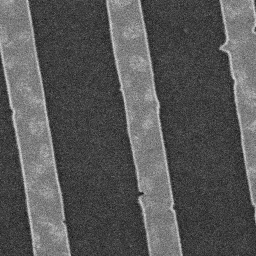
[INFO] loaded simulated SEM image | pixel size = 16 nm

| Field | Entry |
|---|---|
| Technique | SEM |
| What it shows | one or a few lines or trenches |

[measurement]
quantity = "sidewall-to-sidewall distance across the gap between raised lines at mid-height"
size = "1260 nm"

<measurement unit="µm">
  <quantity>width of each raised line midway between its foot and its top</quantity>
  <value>0.521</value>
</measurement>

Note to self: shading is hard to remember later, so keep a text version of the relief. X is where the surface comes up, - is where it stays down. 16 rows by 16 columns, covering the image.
XX-----XX-----XX
XX-----XX-----XX
XX-----XX-----XX
XX-----XX-----XX
XX-----XX------X
XXX-----XX-----X
-XX-----XX-----X
-XX-----XX-----X
-XX-----XX-----X
-XX-----XX-----X
-XX------X-----X
--XX-----XX-----
--XX-----XX-----
--XX-----XX-----
--XX-----XX-----
--XX-----XX-----